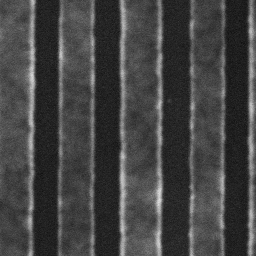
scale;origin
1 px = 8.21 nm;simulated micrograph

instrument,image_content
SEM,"lines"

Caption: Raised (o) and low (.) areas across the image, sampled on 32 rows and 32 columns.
oooo....oooo...ooooo....oooo...o
oooo....oooo...ooooo....oooo...o
oooo....oooo...ooooo....oooo...o
oooo....oooo...ooooo....oooo...o
oooo....oooo...ooooo....oooo...o
oooo....oooo...ooooo....oooo...o
oooo....oooo...ooooo....oooo...o
oooo....oooo...ooooo....oooo...o
oooo....oooo...ooooo....oooo...o
oooo....oooo...ooooo....oooo...o
oooo....oooo...ooooo....oooo...o
oooo....oooo...ooooo....oooo...o
oooo....oooo...ooooo....oooo...o
oooo....oooo...ooooo....oooo...o
oooo....oooo...ooooo....oooo...o
oooo....oooo...ooooo....oooo...o
oooo....oooo...ooooo....oooo...o
oooo....oooo...ooooo....oooo...o
oooo....oooo...ooooo....oooo...o
oooo....oooo...ooooo....oooo...o
oooo....oooo...ooooo....oooo...o
oooo...ooooo...ooooo....oooo...o
oooo...ooooo...ooooo....oooo...o
oooo...ooooo...ooooo....oooo...o
oooo...ooooo...ooooo....oooo...o
oooo...ooooo...ooooo....oooo...o
oooo...ooooo...ooooo....oooo...o
oooo...ooooo...ooooo....oooo...o
oooo...ooooo...ooooo....oooo...o
oooo...ooooo...ooooo....oooo...o
oooo...ooooo...ooooo....oooo...o
oooo...ooooo...ooooo....oooo...o